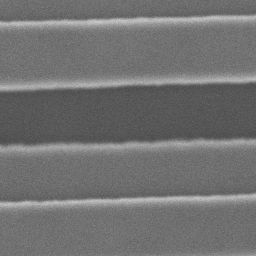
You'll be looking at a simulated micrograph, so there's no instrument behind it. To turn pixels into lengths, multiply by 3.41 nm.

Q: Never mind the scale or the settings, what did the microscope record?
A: lines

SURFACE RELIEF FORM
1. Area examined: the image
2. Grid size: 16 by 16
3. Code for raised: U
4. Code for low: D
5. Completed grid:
UUUUUUUUUUUUUUUU
UUUUUUUUUUUUUUUU
UUUUUUUUUUUUUUUU
UUUUUUUUUUUUUUUU
UUUUUUUUUUUUUUUU
UUDDDDDDDDDDDDDD
DDDDDDDDDDDDDDDD
DDDDDDDDDDDDDDDD
DDDDDDDDDDDDDDDD
UUUUUUUUUUUUUUUU
UUUUUUUUUUUUUUUU
UUUUUUUUUUUUUUUU
UUUUUUUUUUUUUUUU
UUUUUUUUUUUUUUUU
UUUUUUUUUUUUUUUU
UUUUUUUUUUUUUUUU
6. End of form